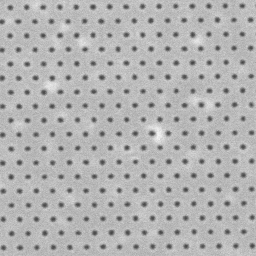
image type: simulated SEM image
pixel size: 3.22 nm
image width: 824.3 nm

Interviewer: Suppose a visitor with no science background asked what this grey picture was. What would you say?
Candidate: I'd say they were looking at a regular array of holes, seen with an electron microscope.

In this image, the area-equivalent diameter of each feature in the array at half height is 0.0189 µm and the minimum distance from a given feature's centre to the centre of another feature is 51.7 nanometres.